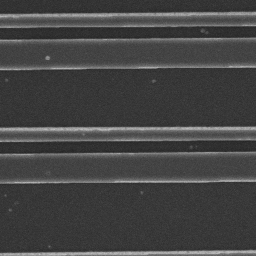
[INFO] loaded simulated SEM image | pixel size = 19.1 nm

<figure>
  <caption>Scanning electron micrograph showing lines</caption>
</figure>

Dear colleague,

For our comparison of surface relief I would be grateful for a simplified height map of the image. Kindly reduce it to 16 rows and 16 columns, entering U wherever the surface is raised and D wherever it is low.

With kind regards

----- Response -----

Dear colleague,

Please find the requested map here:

DDDDDDDDDDDDDDDD
UUUUUUUUUUUUUUUU
UUUUUUUUUUUUUUUU
UUUUUUUUUUUUUUUU
DDDDDDDDDDDDDDDD
DDDDDDDDDDDDDDDD
DDDDDDDDDDDDDDDD
DDDDDDDDDDDDDDDD
UUUUUUUUUUUUUUUU
UUUUUUUUUUUUUUUU
UUUUUUUUUUUUUUUU
DDDDDDDDDDDDDDDD
DDDDDDDDDDDDDDDD
DDDDDDDDDDDDDDDD
DDDDDDDDDDDDDDDD
DDDDDDDDDDDDDDDD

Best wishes